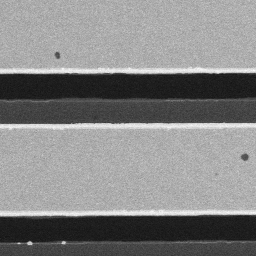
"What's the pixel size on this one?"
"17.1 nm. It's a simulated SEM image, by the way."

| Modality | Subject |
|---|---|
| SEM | lines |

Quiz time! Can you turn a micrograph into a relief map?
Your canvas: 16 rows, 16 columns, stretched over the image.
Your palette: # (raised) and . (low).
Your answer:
################
################
################
################
################
................
................
................
################
################
################
################
################
................
................
................